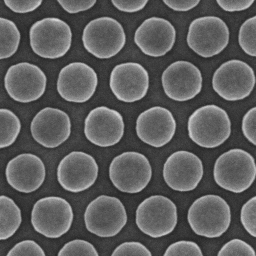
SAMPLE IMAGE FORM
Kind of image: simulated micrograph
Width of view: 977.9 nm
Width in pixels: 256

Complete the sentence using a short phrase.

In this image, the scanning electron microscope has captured a regular array of raised bodies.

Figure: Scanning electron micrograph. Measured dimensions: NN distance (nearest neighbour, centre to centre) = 196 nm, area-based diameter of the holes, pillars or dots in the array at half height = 153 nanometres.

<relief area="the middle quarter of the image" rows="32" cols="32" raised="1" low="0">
01111100000001111110000000111111
11111110000011111111000001111111
11111111000011111111100001111111
11111111000011111111100001111111
11111111000011111111100001111111
11111111000011111111100001111111
11111111000011111111000001111111
11111110000001111111000000111111
11111110000000111110000000011111
00011000000000000000000000000000
00000000000000000000000000000000
00000001111000000000011111000000
00000011111111000001111111100000
10000011111111000001111111100001
10000111111111100011111111110001
10000111111111100011111111110001
10000111111111100011111111110001
10000111111111100011111111100000
10000011111111000001111111100000
00000001111110000000111111000000
00000000000000000000001110000000
00000000000000000000000000000000
01111000000000011110000000011111
11111110000001111111000000111111
11111111000011111111100000111111
11111111000011111111110001111111
11111111000011111111110001111111
11111111000011111111110001111111
11111111000011111111110001111111
11111110000011111111100000111111
11111100000001111111000000111111
01111000000000111110000000000111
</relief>